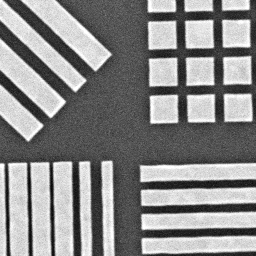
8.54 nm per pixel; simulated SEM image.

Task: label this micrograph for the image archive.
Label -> groups of lines, slits or small figures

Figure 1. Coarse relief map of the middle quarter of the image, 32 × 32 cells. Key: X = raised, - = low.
XX----XXX------------XXXXXXX---X
XXX------------------XXXXXXX---X
XXXX-----------------XXXXXXX---X
XXXXX----------------XXXXXXX---X
-XXXX----------------XXXXXXX---X
-XXX----------------------------
--------------------------------
--------------------------------
----------------------XXXXXX---X
----------------------XXXXXX---X
----------------------XXXXXX---X
----------------------XXXXXX---X
----------------------XXXXXX---X
----------------------XXXXXX---X
----------------------XXXXXX----
--------------------------------
--------------------------------
--------------------------------
--------------------------------
--------------------------------
--------------------------------
--------------------------------
--------------------------------
--------------------------------
-----------X--------------------
XX--XX----XX-------------------X
XX--XX----XX-------XXXXXXXXXXXXX
XX--XX----XX-------XXXXXXXXXXXXX
XX--XX----XX-------XXXXXXXXXXXXX
XX--XX----XX--------------------
XX--XX----XX--------------------
XX--XX----XX----------XX--XXXXXX